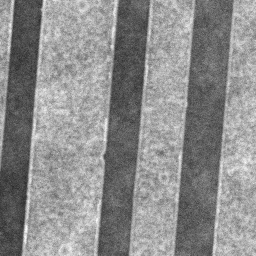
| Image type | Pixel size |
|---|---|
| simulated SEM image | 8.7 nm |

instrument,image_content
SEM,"one or a few lines or trenches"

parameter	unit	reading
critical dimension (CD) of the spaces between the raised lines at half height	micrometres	0.287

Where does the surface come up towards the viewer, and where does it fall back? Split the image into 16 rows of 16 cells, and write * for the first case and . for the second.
*..****..***...*
*..****..***...*
*..****..***..**
*.*****..***..**
*.*****..***..**
..*****..***..**
..*****..***..**
..*****..***..**
..*****..**...**
..*****..**...**
..*****..**...**
..****..***...**
..****..***...**
..****..***...**
..****..***..***
.*****..***..***